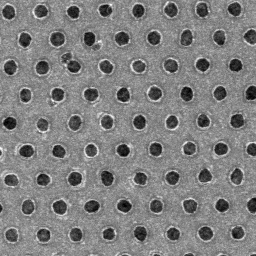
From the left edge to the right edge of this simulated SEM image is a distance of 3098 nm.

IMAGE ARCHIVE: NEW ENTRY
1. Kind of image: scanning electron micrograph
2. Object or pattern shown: a regular array of raised bodies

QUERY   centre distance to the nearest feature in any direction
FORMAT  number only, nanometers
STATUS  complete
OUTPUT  380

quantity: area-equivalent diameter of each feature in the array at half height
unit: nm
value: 181